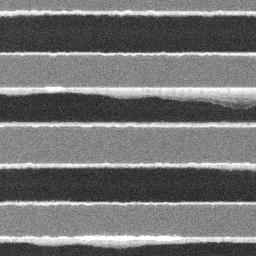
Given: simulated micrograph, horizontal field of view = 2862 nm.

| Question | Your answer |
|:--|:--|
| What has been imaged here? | lines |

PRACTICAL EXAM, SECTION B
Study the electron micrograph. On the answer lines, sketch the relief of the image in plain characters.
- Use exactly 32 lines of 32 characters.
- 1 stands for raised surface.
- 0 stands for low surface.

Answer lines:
11111111111111111111111111111111
01000000001100010001111111101111
00000000000000000000000000000000
00000000000000000000000000000000
00000000000000000000000000000000
00000000000000000000000000000000
00000000000000000000000000000000
11111111111111111111111111111111
11111111111111111111111111111111
11111111111111111111111111111111
11111111111111111111111111111111
00000000000000000000000000000100
00000000000000000000000000000000
00000000000000000000000000000000
00000000000000000000000000000000
00000000000000000000000000000000
11111111111111111111111111111111
11111111111111111111111111111111
11111111111111111111111111111111
11111111111111111111111111111111
11111111111111111111111111111111
00000000000000000000000000000000
00000000000000000000000000000000
00000000000000000000000000000000
00000000000000000000000000000000
11111111111111111111111111111111
11111111111111111111111111111111
11111111111111111111111111111111
11111111111111111111111111111111
11111111111111111111111111111111
00000000000000000000000000000000
00000000000000000000000000000000